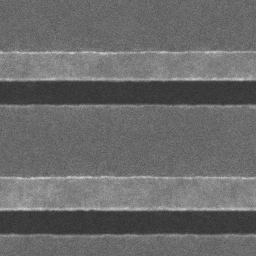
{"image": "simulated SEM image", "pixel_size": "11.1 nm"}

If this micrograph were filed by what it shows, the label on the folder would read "lines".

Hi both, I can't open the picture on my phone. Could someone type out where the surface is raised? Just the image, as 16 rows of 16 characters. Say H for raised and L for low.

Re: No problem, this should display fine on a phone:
HHHHHHHHHHHHHHHH
HHHHHHHHHHHHHHHH
HHHHHHHHHHHHHHHH
HHHHHHHHHHHHHHHH
HHHHHHHHHHHHHHHH
LLLLLLLLLLLLLLLL
LLLLLLLLLLLLLLLL
HHHHHHHHHHHHHHHH
HHHHHHHHHHHHHHHH
HHHHHHHHHHHHHHHH
HHHHHHHHHHHHHHHH
HHHHHHHHHHHHHHHH
HHHHHHHHHHHHHHHH
LLLLLLLLLLLLLLLL
LLLLLLLLLLLLLLLL
HHHHHHHHHHHHHHHH